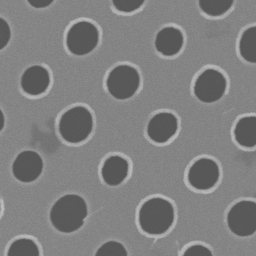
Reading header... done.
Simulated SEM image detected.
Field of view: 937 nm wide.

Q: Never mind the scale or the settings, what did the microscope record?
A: a regular array of holes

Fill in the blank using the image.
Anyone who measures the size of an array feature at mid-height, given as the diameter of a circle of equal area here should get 114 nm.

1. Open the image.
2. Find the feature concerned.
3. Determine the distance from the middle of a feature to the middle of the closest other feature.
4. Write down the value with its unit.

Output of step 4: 221 nm